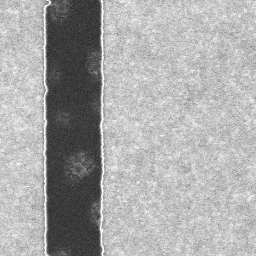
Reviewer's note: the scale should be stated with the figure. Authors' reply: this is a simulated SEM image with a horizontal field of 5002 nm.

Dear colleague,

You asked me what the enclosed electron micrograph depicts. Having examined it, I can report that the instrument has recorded one or a few lines or trenches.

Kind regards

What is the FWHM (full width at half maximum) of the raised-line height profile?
1120 nanometers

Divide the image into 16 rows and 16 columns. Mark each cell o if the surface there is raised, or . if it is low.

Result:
...ooo..........
...ooo..........
...ooo..........
...ooo..........
...ooo..........
...ooo..........
...ooo..........
...ooo..........
...ooo..........
...ooo..........
...ooo..........
...ooo..........
...ooo..........
...ooo..........
...ooo..........
...ooo..........